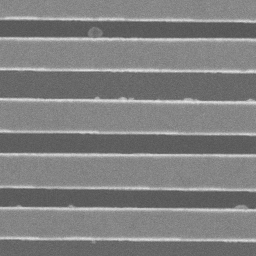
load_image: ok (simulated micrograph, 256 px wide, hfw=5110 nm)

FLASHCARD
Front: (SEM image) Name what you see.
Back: lines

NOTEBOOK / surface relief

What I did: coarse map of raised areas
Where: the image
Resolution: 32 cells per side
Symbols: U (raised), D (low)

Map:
UUUUUUUUUUUUUUUUUUUUUUUUUUUUUUUU
UUUUUUUUUUUUUUUUUUUUUUUUUUUUUUUU
DDDDDDDDDDDDDDDDUUUUUUUUUUUUUUUU
DDDDDDDDDDDDDDDDDDDDDDDDDDDDDDDD
DDDDDDDDDDDDDDDDDDDDDDDDDDDDDDDD
UUUUUUUUUUUUUUUUUUUUUUUUUUUUUUUU
UUUUUUUUUUUUUUUUUUUUUUUUUUUUUUUU
UUUUUUUUUUUUUUUUUUUUUUUUUUUUUUUU
UUUUUUUUUUUUUUUUUUUUUUUUUUUUUUUU
DDDDDDDDDDDDDDDDDDDDDDDDDDDDDDDD
DDDDDDDDDDDDDDDDDDDDDDDDDDDDDDDD
DDDDDDDDDDDDDDDDDDDDDDDDDDDDDDDD
UUUUUUUUUUUUUDDDDDDDDDDDDDDDDDDD
UUUUUUUUUUUUUUUUUUUUUUUUUUUUUUUU
UUUUUUUUUUUUUUUUUUUUUUUUUUUUUUUU
UUUUUUUUUUUUUUUUUUUUUUUUUUUUUUUU
DDDUUUUUUUUUUUUUUUUUUUUUUUUUUUUU
DDDDDDDDDDDDDDDDDDDDDDDDDDDDDDDD
DDDDDDDDDDDDDDDDDDDDDDDDDDDDDDDD
UUUUUUUUUUUUUUUUUUUUUUUUUUUUUUUU
UUUUUUUUUUUUUUUUUUUUUUUUUUUUUUUU
UUUUUUUUUUUUUUUUUUUUUUUUUUUUUUUU
UUUUUUUUUUUUUUUUUUUUUUUUUUUUUUUU
DDDDDDDDUUUUUUUUUUUUUUUUUUUUUUUU
DDDDDDDDDDDDDDDDDDDDDDDDDDDDDDDD
DDDDDDDDDDDDDDDDDDDDDDDDDDDDDDDD
UUUUUUUUUUUUUUUUUUUUUUUUUUUUUUUU
UUUUUUUUUUUUUUUUUUUUUUUUUUUUUUUU
UUUUUUUUUUUUUUUUUUUUUUUUUUUUUUUU
UUUUUUUUUUUUUUUUUUUUUUUUUUUUUUUU
DDDDDDDDDDDDDDDDDDDDDDDDDDDDDDDD
DDDDDDDDDDDDDDDDDDDDDDDDDDDDDDDD